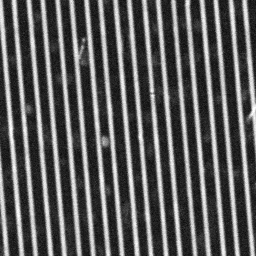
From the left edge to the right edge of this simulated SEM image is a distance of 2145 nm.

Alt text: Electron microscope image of parallel lines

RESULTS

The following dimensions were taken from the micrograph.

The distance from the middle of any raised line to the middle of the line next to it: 0.12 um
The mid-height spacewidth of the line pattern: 99.1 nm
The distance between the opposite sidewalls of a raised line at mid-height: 19.8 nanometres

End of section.